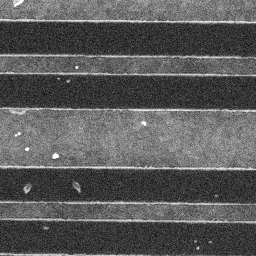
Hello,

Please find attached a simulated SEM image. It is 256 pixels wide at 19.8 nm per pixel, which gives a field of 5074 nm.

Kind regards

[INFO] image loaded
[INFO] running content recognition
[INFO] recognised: lines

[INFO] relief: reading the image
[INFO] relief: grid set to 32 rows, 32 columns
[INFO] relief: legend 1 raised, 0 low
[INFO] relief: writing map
00000000000000000000000000000000
00000000000000000000000000000000
11111100000000000000000000000000
11111111111111111111111111111111
11111111111111111111111111111111
11111111111111111111111111111111
11111111111111111111111111111111
00000000000000000000000000000000
00000000000000000000000000000000
11111111111111111111111111111111
11111111111111111111111111111111
11111111111111111111111111111111
11111111111111111111111111111111
11111111111111111111111111111111
00000000000000000000000000000000
00000000000000000000000000000000
00000000000000000000000000000000
00000000000000000000000000000000
00000000000000000000000000000000
00000000000000000000000000000000
00000000000000000000000000000000
11111111111111111111111111111111
11111111111111111111111111111111
11111111111111111111111111111111
11111111111111111111111111111111
00000000000000000000000000111111
00000000000000000000000000000000
11111111000000000000000000000000
11111111111111111111111111111111
11111111111111111111111111111111
11111111111111111111111111111111
11111111111111111111111111111111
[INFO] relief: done